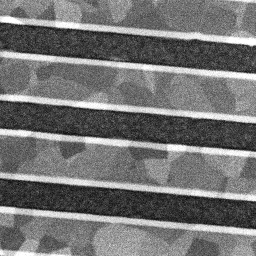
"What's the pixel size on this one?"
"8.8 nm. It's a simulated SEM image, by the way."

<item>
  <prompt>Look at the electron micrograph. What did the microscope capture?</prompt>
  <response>one or a few lines or trenches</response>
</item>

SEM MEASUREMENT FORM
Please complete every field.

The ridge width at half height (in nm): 378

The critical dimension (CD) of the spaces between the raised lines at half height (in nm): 305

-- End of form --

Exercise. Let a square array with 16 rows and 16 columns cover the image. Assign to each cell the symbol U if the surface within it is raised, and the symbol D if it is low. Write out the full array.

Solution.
UUUUUUUUUUUUUUUU
DDDUUUUUUUUUUUUU
DDDDDDDDDDDDDDDU
UUDDDDDDDDDDDDDD
UUUUUUUUUUUUUDDD
UUUUUUUUUUUUUUUU
DDDDDUUUUUUUUUUU
DDDDDDDDDDDDDDDU
UUUDDDDDDDDDDDDD
UUUUUUUUUUUUUUDD
UUUUUUUUUUUUUUUU
DDDDDDUUUUUUUUUU
DDDDDDDDDDDDDDDD
UUUUUDDDDDDDDDDD
UUUUUUUUUUUUUUUU
UUUUUUUUUUUUUUUU